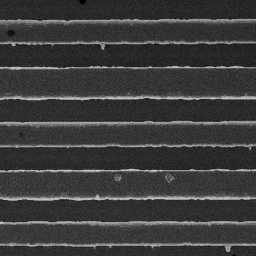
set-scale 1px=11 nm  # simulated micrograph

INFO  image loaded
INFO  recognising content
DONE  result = lines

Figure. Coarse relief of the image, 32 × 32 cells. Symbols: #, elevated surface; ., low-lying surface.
................................
................................
.....................#........##
################################
################################
............#...................
................................
................................
################################
################################
################################
################################
................................
................................
................................
################################
################################
################################
................................
................................
................................
################################
################################
################################
################################
................................
................................
................................
################################
################################
################################
................................